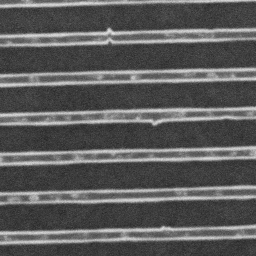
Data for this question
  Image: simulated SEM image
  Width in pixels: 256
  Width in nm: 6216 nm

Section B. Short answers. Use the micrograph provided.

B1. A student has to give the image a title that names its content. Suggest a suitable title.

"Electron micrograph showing parallel lines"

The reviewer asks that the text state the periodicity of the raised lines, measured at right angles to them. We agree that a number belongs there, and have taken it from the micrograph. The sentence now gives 959 nanometers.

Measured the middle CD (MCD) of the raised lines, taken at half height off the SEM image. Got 0.252 micrometres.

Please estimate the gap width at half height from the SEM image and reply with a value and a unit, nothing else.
710 nm